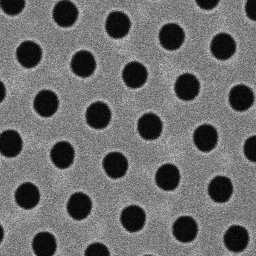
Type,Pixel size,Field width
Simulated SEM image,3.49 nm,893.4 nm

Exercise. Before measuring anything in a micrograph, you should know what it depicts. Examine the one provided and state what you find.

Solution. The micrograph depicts a regular array of holes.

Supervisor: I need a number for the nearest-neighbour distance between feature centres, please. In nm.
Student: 183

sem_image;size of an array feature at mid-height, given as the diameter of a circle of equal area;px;26.4